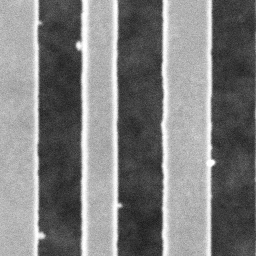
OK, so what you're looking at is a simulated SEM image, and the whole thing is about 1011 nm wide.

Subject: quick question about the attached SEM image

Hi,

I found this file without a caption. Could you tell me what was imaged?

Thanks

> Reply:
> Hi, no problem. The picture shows lines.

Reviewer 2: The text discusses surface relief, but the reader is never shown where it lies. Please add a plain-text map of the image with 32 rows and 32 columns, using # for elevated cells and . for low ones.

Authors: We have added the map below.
#####.....#####......#####......
#####.....#####.....######......
#####.....#####.....######......
#####.....#####......#####......
#####.....#####.....######......
#####.....#####.....######......
#####.....#####.....######......
#####......####.....######......
#####......###......######......
#####.....#####.....######......
#####.....#####.....######......
#####.....#####......#####......
#####.....#####.....######......
#####.....#####......#####......
#####.....#####.....######......
#####.....#####.....######......
#####.....#####.....######......
#####.....#####.....######......
#####.....#####.....######......
#####.....#####......#####......
#####.....#####.....#######.....
#####.....#####.....######......
#####.....#####......#####......
#####.....#####......#####......
#####.....#####.....######......
#####.....#####.....######......
#####.....#####.....######......
#####.....#####.....######......
#####.....#####.....######......
#####.....#####.....######......
#####.....#####......#####......
#####.....#####.....######......